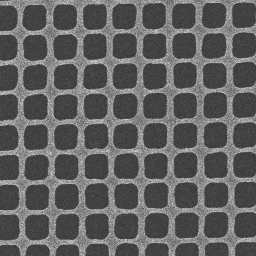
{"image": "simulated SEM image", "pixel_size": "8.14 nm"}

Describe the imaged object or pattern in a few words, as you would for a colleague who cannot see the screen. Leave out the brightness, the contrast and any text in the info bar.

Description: a regular array of holes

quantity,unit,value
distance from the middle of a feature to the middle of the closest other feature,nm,242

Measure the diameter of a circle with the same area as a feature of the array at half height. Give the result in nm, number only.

217